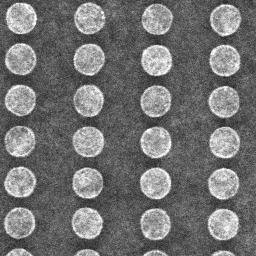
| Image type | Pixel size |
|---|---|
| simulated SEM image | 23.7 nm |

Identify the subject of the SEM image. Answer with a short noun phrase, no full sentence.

a regular array of raised bodies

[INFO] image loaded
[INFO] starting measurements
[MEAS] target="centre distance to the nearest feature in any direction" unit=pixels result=40.7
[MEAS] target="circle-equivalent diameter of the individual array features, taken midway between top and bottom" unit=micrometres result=0.719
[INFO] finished